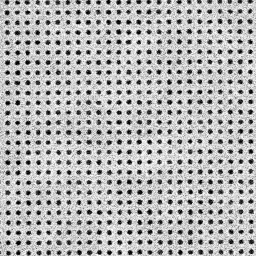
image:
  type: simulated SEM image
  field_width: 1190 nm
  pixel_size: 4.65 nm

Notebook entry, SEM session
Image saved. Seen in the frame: a regular array of holes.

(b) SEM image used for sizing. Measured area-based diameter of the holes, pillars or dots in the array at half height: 26.2 nm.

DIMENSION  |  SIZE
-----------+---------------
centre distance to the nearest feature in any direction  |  45.5 nanometres